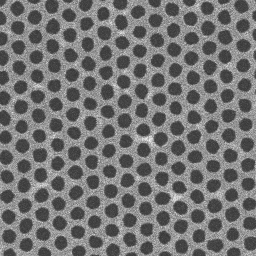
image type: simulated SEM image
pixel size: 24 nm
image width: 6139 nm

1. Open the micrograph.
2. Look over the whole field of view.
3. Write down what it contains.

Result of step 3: a regular array of holes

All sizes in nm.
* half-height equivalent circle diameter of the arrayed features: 348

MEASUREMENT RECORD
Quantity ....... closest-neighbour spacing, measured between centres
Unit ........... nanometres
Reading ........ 462